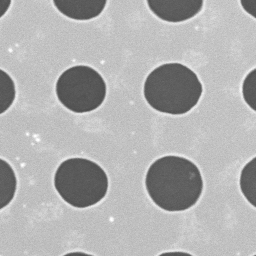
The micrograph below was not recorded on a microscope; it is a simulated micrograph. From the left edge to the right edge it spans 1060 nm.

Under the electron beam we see holes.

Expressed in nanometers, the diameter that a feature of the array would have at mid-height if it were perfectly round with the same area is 219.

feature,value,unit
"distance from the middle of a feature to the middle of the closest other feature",382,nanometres